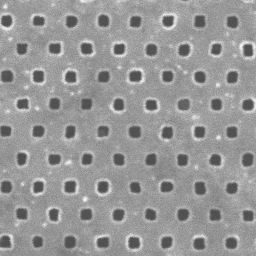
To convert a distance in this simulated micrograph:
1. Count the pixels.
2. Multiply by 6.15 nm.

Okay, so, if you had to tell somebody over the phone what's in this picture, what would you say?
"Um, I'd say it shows a regular array of holes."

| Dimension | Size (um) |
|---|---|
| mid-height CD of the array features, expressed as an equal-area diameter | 0.0766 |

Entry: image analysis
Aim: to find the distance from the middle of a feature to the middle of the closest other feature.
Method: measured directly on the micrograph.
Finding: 193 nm